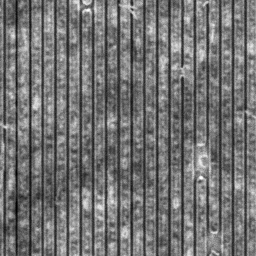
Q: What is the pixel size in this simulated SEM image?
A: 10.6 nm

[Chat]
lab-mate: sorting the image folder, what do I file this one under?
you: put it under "parallel lines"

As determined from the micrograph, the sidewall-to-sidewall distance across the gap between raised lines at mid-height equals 39.7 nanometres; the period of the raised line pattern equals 134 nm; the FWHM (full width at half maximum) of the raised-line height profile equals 89.9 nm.